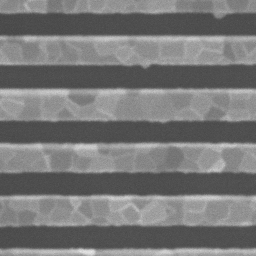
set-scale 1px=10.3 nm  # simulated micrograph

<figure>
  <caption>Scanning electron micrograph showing lines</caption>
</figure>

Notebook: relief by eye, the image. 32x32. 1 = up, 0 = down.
11111111111111111111111111111111
11000100110111110011000000001110
00000000000000000000000000000000
00000000000000000000000000000000
00000000000000000000000000000000
11111111111111111111111111111111
11111111111111111111111111111111
11111111111111111111111111111111
00000000000000000000000000000000
00000000000000000000000000000000
00000000000000000000000000000000
11111111111111111111111111111111
11111111111111111111111111111111
11111111111111111111111111111111
11111111111111111111111111111111
00000000000000000000000000000000
00000000000000000000000000000000
00000000000000000000000000000000
11111111111111111111111111111111
11111111111111111111111111111111
11111111111111111111111111111111
11100100011110001101000011100111
00000000000000000000000000000000
00000000000000000000000000000000
00000000000000000000000000000000
11111111111111111111111111111111
11111111111111111111111111111111
11111111111111111111111111111111
00000000000000000000000000000000
00000000000000000000000000000000
00000000000000000000000000000000
11111111111111111111111111111111